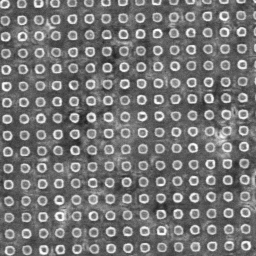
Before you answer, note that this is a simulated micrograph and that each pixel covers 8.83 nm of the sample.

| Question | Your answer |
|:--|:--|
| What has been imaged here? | a regular array of raised bodies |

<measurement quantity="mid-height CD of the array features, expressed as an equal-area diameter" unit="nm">83.4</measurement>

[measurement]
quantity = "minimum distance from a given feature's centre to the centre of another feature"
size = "144 nanometres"